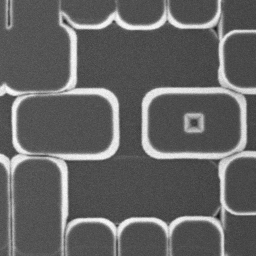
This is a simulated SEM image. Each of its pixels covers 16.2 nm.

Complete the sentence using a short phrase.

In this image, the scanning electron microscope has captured wiring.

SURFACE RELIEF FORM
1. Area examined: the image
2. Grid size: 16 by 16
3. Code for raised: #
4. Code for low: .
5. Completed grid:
##############..
#######.##.##...
#####.........##
#####.........##
#####.........##
#####.........##
.######..######.
.######..######.
.######..######.
.######...#####.
####..........##
####..........##
####..........##
####............
##############..
##############..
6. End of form